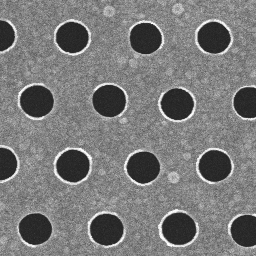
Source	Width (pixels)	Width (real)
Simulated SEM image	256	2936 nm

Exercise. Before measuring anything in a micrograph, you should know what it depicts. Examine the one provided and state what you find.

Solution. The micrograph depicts a regular array of holes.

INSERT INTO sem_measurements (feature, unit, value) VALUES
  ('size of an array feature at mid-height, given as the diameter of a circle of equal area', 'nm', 372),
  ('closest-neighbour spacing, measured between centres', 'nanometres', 809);